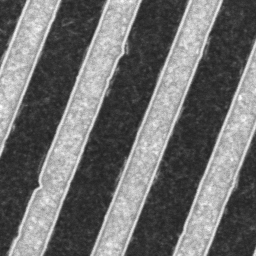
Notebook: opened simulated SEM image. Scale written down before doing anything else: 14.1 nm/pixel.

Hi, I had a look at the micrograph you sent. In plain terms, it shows one or a few lines or trenches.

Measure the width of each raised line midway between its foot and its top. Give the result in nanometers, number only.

676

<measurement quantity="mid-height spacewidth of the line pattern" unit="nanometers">404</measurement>